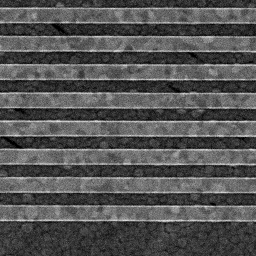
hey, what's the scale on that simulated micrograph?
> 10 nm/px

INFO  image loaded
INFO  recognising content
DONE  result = parallel lines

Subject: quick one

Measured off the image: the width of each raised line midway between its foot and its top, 150 nm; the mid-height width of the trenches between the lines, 131 nm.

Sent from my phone